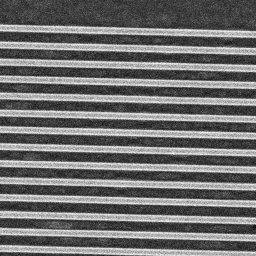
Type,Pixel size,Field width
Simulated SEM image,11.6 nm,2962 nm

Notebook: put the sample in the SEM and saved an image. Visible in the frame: parallel lines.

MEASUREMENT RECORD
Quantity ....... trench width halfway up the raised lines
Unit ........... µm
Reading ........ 0.129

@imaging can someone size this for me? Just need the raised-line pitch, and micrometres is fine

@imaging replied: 0.196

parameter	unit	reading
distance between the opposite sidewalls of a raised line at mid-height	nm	69.4